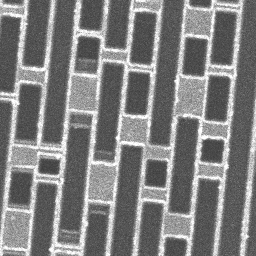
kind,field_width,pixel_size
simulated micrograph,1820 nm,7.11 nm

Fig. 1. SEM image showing parallel lines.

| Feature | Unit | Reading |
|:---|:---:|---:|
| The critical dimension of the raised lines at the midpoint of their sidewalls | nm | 49.5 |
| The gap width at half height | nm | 142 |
